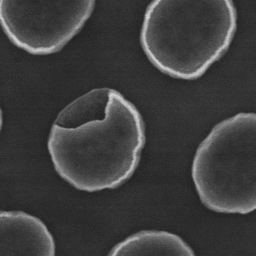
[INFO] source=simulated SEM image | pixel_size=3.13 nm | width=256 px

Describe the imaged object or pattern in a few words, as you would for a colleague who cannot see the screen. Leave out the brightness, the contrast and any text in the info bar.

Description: raised bodies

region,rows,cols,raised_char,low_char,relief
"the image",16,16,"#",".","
######...#####..
#####....######.
.###.....#####..
.........#####..
...........##...
................
.......#........
......###.....##
...######....###
...######...####
....####....####
.....##.....####
.............###
##..............
###.............
###....#####....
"